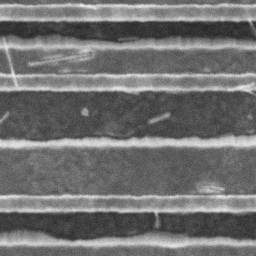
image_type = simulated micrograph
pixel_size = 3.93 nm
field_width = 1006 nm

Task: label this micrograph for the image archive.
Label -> lines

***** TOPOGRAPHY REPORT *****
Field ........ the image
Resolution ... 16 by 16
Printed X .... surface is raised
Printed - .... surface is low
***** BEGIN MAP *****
XXXXXXXXXXXXXXXX
----------------
----------------
XXXXXXXXXXXXXXXX
XXXXXXXXXXXXXXXX
XXXXXXXXXXXXXXXX
----------------
----------------
----------------
XXXXXXXXXXXXXXXX
XXXXXXXXXXXXXXXX
XXXXXXXXXXXXXXXX
XXXXXXXXXXXXXXXX
----------------
----------------
XXXXXXXXXXXXXXXX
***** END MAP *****